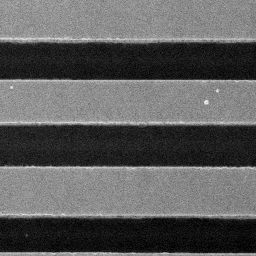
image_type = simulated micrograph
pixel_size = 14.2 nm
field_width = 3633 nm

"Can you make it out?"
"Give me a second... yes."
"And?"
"lines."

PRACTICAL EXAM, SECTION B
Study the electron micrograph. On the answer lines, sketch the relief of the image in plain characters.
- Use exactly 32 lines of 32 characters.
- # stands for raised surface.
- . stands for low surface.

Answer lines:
################################
################################
################################
################################
################################
................................
................................
................................
................................
................................
################################
################################
################################
################################
################################
................................
................................
................................
................................
................................
................................
################################
################################
################################
################################
################################
################################
................................
................................
................................
................................
................................